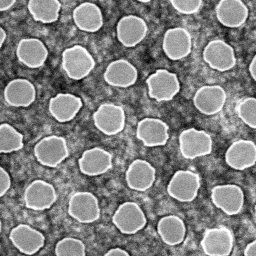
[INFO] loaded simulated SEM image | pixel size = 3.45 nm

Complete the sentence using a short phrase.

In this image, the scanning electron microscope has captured a regular array of raised bodies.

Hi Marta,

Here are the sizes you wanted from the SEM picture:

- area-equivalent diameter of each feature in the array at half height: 103 nanometers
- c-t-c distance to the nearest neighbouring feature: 153 nanometres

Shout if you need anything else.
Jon